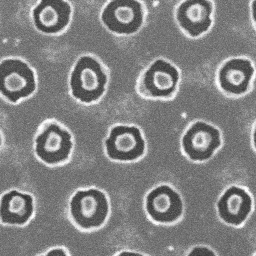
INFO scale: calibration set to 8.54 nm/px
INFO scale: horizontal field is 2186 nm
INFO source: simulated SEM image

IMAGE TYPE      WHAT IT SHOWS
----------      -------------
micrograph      a regular array of ring-shaped grooves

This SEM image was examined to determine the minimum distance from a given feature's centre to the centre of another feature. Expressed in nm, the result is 607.